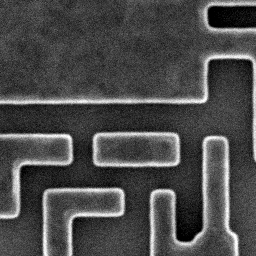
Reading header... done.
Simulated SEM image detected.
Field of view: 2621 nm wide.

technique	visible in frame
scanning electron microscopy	wiring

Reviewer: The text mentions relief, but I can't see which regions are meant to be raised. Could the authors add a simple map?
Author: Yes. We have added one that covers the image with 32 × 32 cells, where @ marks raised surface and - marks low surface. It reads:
@@@@@@@@@@@@@@@@@@@@@@@@@@@@@@@@
@@@@@@@@@@@@@@@@@@@@@@@@@@------
@@@@@@@@@@@@@@@@@@@@@@@@@@------
@@@@@@@@@@@@@@@@@@@@@@@@@@@-----
@@@@@@@@@@@@@@@@@@@@@@@@@@@@@@@@
@@@@@@@@@@@@@@@@@@@@@@@@@@@@@@@@
@@@@@@@@@@@@@@@@@@@@@@@@@@@@@@@@
@@@@@@@@@@@@@@@@@@@@@@@@@@-----@
@@@@@@@@@@@@@@@@@@@@@@@@@@------
@@@@@@@@@@@@@@@@@@@@@@@@@@------
@@@@@@@@@@@@@@@@@@@@@@@@@@------
@@@@@@@@@@@@@@@@@@@@@@@@@@------
@@@@@@@@@@@@@@@@@@@@@@@@@@------
--------------------------------
--------------------------------
--------------------------------
--------------------------------
@@@@@@@@@---@@@@@@@@@@----@@----
@@@@@@@@@---@@@@@@@@@@---@@@----
@@@@@@@@@---@@@@@@@@@@---@@@----
@@@@@@@@@---@@@@@@@@@@---@@@----
@@-----------------------@@@----
@@-----------------------@@@----
@@-----------------------@@@----
@@---@@@@@@@@@@----@@@---@@@----
@@---@@@@@@@@@@----@@@---@@@----
@@----@@@@@@@@@----@@@---@@@----
------@@@----------@@@---@@@----
------@@@----------@@@---@@@@---
------@@@----------@@@---@@@@---
------@@@----------@@@@@@@@@@@--
------@@@----------@@@@@@@@@@@--